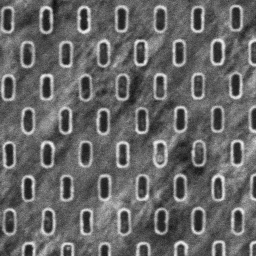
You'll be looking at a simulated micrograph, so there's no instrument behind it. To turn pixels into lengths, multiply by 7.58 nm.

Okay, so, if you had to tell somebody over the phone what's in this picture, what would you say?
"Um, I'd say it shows a regular array of raised bodies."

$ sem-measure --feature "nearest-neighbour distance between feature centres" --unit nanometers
284